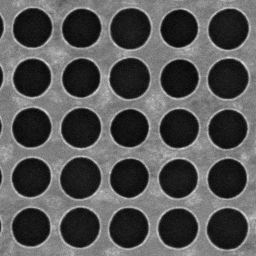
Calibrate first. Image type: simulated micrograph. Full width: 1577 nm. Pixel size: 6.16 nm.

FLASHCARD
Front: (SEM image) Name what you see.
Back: a regular array of holes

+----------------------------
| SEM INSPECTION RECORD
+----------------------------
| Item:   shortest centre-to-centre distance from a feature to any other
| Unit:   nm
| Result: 300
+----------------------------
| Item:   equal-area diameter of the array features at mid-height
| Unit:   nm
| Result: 245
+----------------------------